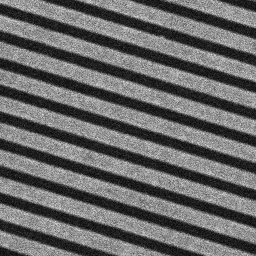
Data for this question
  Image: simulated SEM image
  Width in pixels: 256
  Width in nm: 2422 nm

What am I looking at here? parallel lines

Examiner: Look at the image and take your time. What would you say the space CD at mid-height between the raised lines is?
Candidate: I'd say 99.5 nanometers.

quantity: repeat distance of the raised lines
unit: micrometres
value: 0.244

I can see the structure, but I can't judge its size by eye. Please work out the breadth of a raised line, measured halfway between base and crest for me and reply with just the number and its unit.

142 nm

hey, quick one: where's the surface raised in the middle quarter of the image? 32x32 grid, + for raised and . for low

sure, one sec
++++.........++++++++++++.......
+++++++.........+++++++++++++...
++++++++++.........+++++++++++++
.++++++++++++..........+++++++++
....+++++++++++++.........++++++
.......+++++++++++++.........+++
+..........++++++++++++.........
+++++.........++++++++++++......
++++++++.........+++++++++++++..
+++++++++++.........++++++++++++
..++++++++++++..........++++++++
.....+++++++++++++.........+++++
........+++++++++++++.........++
++..........++++++++++++........
++++++.........++++++++++++.....
+++++++++.........+++++++++++++.
++++++++++++.........+++++++++++
..+++++++++++++..........+++++++
.....++++++++++++++.........++++
.........+++++++++++++.........+
+++.........+++++++++++++.......
+++++++........+++++++++++++....
++++++++++.........+++++++++++++
+++++++++++++.........++++++++++
...+++++++++++++..........++++++
......++++++++++++++........++++
+.........+++++++++++++........+
++++.........+++++++++++++......
+++++++.........+++++++++++++...
++++++++++.........+++++++++++++
.++++++++++++.........++++++++++
....+++++++++++++.........++++++